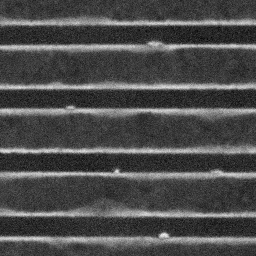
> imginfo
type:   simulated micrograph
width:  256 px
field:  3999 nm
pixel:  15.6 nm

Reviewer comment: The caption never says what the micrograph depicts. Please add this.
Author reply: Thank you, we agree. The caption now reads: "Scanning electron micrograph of lines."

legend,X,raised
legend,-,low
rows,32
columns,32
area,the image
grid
XXXXXXXXXXXXXXXXXXXXXXXXXXXXXXXX
XXXXXXXXXXXXXXXXXXXXXXXXXXXXXXXX
XXXXXXXXXXXXXXXXXXXXXXXXXXXXXXXX
--------------------------------
--------------------------------
--------------------------------
XXXXXXXXXXXXXXXXXXXXXXXXXXXXXXXX
XXXXXXXXXXXXXXXXXXXXXXXXXXXXXXXX
XXXXXXXXXXXXXXXXXXXXXXXXXXXXXXXX
XXXXXXXXXXXXXXXXXXXXXXXXXXXXXXXX
XXXXXXXXXXXXXXXXXXXXXXXXXXXXXXXX
--------------------------------
--------------------------------
--------------------------------
XXXXXXXXXXXXXXXXXXXXXXXXXXXXXXXX
XXXXXXXXXXXXXXXXXXXXXXXXXXXXXXXX
XXXXXXXXXXXXXXXXXXXXXXXXXXXXXXXX
XXXXXXXXXXXXXXXXXXXXXXXXXXXXXXXX
XXXXXXXXXXXXXXXXXXXXXXXXXXXXXXXX
--------------------------------
--------------------------------
--------------------------------
XXXXXXXXXXXXXXXXXXXXXXXXXXXXXXXX
XXXXXXXXXXXXXXXXXXXXXXXXXXXXXXXX
XXXXXXXXXXXXXXXXXXXXXXXXXXXXXXXX
XXXXXXXXXXXXXXXXXXXXXXXXXXXXXXXX
XXXXXXXXXXXX---XXXXXXXXXXXXXXXXX
--------------------------------
--------------------------------
--------------------------------
XXXXXXXXXXXXXXXXXXXXXXXXXXXXXXXX
XXXXXXXXXXXXXXXXXXXXXXXXXXXXXXXX